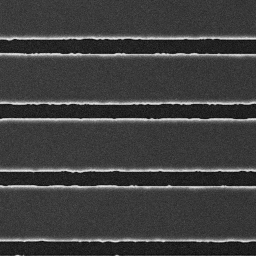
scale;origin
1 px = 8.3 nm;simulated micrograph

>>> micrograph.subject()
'lines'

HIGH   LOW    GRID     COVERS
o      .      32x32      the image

oooooooooooooooooooooooooooooooo
oooooooooooooooooooooooooooooooo
oooooooooooooooooooooooooooooooo
oooooooooooooooooooooooooooooooo
oooooooooooooooooooooooooooooooo
................................
................................
oooooooooooooooooooooooooooooooo
oooooooooooooooooooooooooooooooo
oooooooooooooooooooooooooooooooo
oooooooooooooooooooooooooooooooo
oooooooooooooooooooooooooooooooo
oooooooooooooooooooooooooooooooo
................................
................................
oooooooooooooooooooooooooooooooo
oooooooooooooooooooooooooooooooo
oooooooooooooooooooooooooooooooo
oooooooooooooooooooooooooooooooo
oooooooooooooooooooooooooooooooo
oooooooooooooooooooooooooooooooo
................................
................................
oooooooooooooooooooooooooooooooo
oooooooooooooooooooooooooooooooo
oooooooooooooooooooooooooooooooo
oooooooooooooooooooooooooooooooo
oooooooooooooooooooooooooooooooo
oooooooooooooooooooooooooooooooo
oooooooooooooooooooooooooooooooo
................................
................................